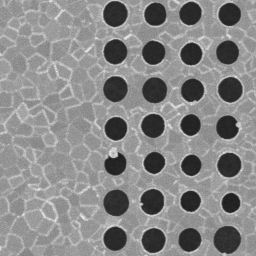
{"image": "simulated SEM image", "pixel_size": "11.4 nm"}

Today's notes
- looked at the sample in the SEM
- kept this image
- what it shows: a regular array of holes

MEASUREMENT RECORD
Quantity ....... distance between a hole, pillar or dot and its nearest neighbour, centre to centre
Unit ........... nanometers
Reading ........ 410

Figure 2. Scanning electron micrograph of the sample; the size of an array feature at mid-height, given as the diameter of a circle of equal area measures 23.6 pixels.